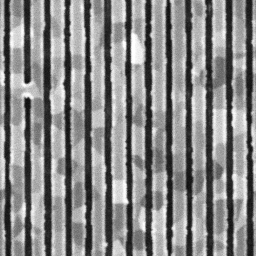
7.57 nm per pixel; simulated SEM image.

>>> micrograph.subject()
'parallel lines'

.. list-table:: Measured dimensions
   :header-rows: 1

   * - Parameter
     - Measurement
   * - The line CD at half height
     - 98.5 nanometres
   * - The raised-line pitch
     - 153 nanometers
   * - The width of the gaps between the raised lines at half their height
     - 49.2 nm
